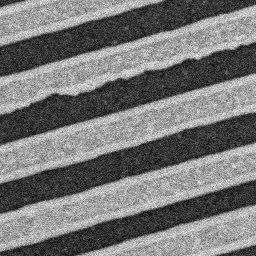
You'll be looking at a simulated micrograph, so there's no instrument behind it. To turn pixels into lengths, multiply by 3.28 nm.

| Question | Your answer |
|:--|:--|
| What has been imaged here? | one or a few lines or trenches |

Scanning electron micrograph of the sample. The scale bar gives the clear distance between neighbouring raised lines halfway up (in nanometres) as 126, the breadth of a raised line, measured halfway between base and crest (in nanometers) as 90.8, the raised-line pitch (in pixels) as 65.7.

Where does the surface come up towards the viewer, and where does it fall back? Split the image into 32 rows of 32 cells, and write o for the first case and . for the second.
....ooooooooooooo...............
ooooooooooooo..................o
oooooooooo.................ooooo
oooooo..................oooooooo
oo...................ooooooooooo
.................ooooooooooooo..
.............oooooooooooo.......
..........oooooooooooo..........
......oooooooooooo..............
...oooooooooooo.................
ooooooooooo..................ooo
ooooo.....................oooooo
oooo..................oooooooooo
o..................ooooooooooooo
...............ooooooooooooo....
...........ooooooooooooo........
........ooooooooooooo...........
....oooooooooooooo..............
.ooooooooooooo..................
ooooooooooo.................oooo
ooooooo.................oooooooo
ooo..................ooooooooooo
.................oooooooooooo...
..............oooooooooooo......
...........oooooooooooo.........
.......ooooooooooooo............
...ooooooooooooo...............o
oooooooooooo...............ooooo
ooooooooo...............oooooooo
ooooo...............oooooooooooo
oo...............ooooooooooooo..
..............oooooooooooo......